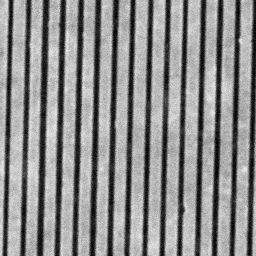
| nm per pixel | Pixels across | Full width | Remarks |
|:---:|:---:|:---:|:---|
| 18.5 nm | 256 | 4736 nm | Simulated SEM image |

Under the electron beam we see parallel lines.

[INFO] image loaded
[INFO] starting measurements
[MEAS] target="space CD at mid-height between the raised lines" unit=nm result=127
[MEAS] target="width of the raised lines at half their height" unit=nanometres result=192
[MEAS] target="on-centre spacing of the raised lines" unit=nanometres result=323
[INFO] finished